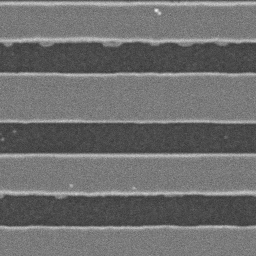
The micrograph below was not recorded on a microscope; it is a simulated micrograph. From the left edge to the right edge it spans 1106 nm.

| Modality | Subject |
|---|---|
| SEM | lines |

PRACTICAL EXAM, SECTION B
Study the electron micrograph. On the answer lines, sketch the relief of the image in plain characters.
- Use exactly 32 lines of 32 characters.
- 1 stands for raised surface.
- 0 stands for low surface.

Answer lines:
11111111111111111111111111111111
11111111111111111111111111111111
11111111111111111111111111111111
11111111111111111111111111111111
11111111111111111111111111111111
00000000000000000000000000000000
00000000000000000000000000000000
00000000000000000000000000000000
00000000000000000000000000000000
11111111111111111111111111111111
11111111111111111111111111111111
11111111111111111111111111111111
11111111111111111111111111111111
11111111111111111111111111111111
11111111111111111111111111111111
00000000000000000000000000000000
00000000000000000000000000000000
00000000000000000000000000000000
00000000000000000000000000000000
11111111111111111111111111111111
11111111111111111111111111111111
11111111111111111111111111111111
11111111111111111111111111111111
11111111111111111111111111111111
00000000000000000000000000000000
00000000000000000000000000000000
00000000000000000000000000000000
00000000000000000000000000000000
11111111111111111111111111111111
11111111111111111111111111111111
11111111111111111111111111111111
11111111111111111111111111111111